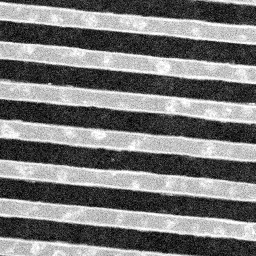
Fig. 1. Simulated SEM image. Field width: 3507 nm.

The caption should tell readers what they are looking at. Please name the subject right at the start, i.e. parallel lines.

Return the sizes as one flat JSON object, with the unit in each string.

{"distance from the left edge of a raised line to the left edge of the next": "533 nanometres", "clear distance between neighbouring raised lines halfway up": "305 nm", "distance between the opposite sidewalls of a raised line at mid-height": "232 nanometres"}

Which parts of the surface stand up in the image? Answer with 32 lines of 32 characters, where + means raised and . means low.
+..............................+
+++++++++++.....................
.++++++++++++++++++++...........
...........+++++++++++++++++++++
......................++++++++++
++++............................
+++++++++++++...................
...++++++++++++++++++++.........
.............+++++++++++++++++++
......................++++++++++
+++.............................
++++++++++++++..................
..++++++++++++++++++++++........
..............++++++++++++++++++
........................++++++++
++++............................
++++++++++++++..................
...++++++++++++++++++++++.......
..............++++++++++++++++++
........................++++++++
+++++...........................
+++++++++++++++++...............
.....++++++++++++++++++++++.....
...............+++++++++++++++++
..........................++++++
++++++..........................
+++++++++++++++++...............
.......+++++++++++++++++++++....
................++++++++++++++++
...........................+++++
++++++++........................
++++++++++++++++++..............